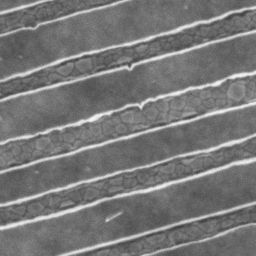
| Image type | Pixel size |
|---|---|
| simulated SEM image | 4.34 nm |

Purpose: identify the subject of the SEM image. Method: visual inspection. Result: one or a few lines or trenches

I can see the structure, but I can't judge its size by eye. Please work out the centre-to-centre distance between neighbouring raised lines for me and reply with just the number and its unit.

273 nm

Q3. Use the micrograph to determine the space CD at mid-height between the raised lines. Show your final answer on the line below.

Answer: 93.2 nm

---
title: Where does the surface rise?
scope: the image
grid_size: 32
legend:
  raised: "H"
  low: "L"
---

HHHHLLLLLLLLLLHHHHHHHHHHHHHHHHHH
HLLLLLLLLLHHHHHHHHHHHHHHHHHHHLLL
LLLLLLLHHHHHHHHHHHHHHHHHHHHLLLLL
LLLHHHHHHHHHHHHHHHHHHHHLLLLLLLLL
HHHHHHHHHHHHHHHHHHHHLLLLLLLLLHHH
HHHHHHHHHHHHHHHHHLLLLLLLLLHHHHHH
HHHHHHHHHHHHLLLLLLLLLLHHHHHHHHHH
HHHHHHHHLLLLLLLLLLHHHHHHHHHHHHHH
HHHHHLLLLLLLLLLHHHHHHHHHHHHHHHHH
HHLLLLLLLLLHHHHHHHHHHHHHHHHHHHLL
LLLLLLLHHHHHHHHHHHHHHHHHHHHLLLLL
LLLHHHHHHHHHHHHHHHHHHHHLLLLLLLLL
HHHHHHHHHHHHHHHHHHHLLLLLLLLLLLLL
HHHHHHHHHHHHHHHHLLLLLLLLLLLLLHHH
HHHHHHHHHHHHHLLLLLLLLLLLLHHHHHHH
HHHHHHHHHHLLLLLLLLLLLLHHHHHHHHHH
HHHHHHLLLLLLLLLLLLHHHHHHHHHHHHHH
HHLLLLLLLLLLLLHHHHHHHHHHHHHHHHHL
LLLLLLLLLLHHHHHHHHHHHHHHHHHLLLLL
LLLLLLLHHHHHHHHHHHHHHHHLLLLLLLLL
LLLLHHHHHHHHHHHHHHHHLLLLLLLLLHHH
HHHHHHHHHHHHHHHLLLLLLLLLLLHHHHHH
HHHHHHHHHHHHLLLLLLLLLLLHHHHHHHHH
HHHHHHHHLLLLLLLLLLLHHHHHHHHHHHHH
HHHHHLLLLLLLLLLHHHHHHHHHHHHHHHHH
HLLLLLLLLLLHHHHHHHHHHHHHHHHHHHHH
LLLLLLLLHHHHHHHHHHHHHHHHHHHHLLLL
LLLLHHHHHHHHHHHHHHHHHHHHLLLLLLLL
HHHHHHHHHHHHHHHHHHHHHLLLLLLLLHHH
HHHHHHHHHHHHHHHHHLLLLLLLLLLHHHHH
HHHHHHHHHHHHHHLLLLLLLLLHHHHHHHHH
HHHHHHHHHHLLLLLLLLLHHHHHHHHHHHHH